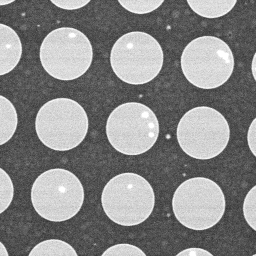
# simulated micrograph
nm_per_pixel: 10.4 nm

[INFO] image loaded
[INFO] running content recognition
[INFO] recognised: an array of small figures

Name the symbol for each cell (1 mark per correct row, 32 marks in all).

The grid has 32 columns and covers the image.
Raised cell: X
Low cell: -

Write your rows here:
X------XXXX----XXXXX----XXXXX---
-----------------XX------XXX----
--------------------------------
X-------------------------------
XX----XXXXX----XXXX-------------
XXX--XXXXXX---XXXXXX----XXXX----
XXX--XXXXXXX--XXXXXX---XXXXXX---
XX---XXXXXX---XXXXXX---XXXXXX---
XX----XXXXX---XXXXXX---XXXXXX---
-------XXX-----XXXX----XXXXXX---
------------------------XXXX----
--------------------------------
X------XX-----------------------
XX---XXXXX-----XXX-------X------
XX---XXXXXX---XXXXX----XXXXX----
XX---XXXXXX--XXXXXXX--XXXXXX---X
XX---XXXXXX--XXXXXXX--XXXXXXX--X
X----XXXXX----XXXXXX--XXXXXXX--X
------XXX-----XXXXX----XXXXX---X
------------------------XXX-----
--------------------------------
X-----XXX-----------------------
X---XXXXXX----XXXX-----XXX------
XX--XXXXXX---XXXXXX---XXXXX-----
XX--XXXXXX---XXXXXX---XXXXXX---X
X---XXXXXX---XXXXXX---XXXXXX--XX
-----XXXXX---XXXXXX---XXXXXX--XX
------XX------XXXX----XXXXX----X
------------------------XX------
--------------------------------
-----XXX------------------------
X---XXXXX----XXXXX-----XXX------